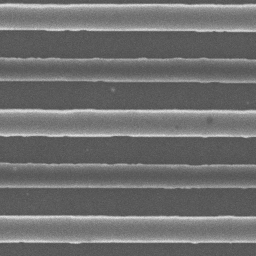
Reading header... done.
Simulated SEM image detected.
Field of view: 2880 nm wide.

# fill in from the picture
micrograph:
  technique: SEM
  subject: lines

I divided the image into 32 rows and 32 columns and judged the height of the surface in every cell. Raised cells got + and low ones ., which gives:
................................
++++++++++++++++++++++++++++++++
++++++++++++++++++++++++++++++++
++++++++++++++++++++++++++++++++
................................
................................
................................
+++++++++++++++++++++++++++++++.
++++++++++++++++++++++++++++++++
++++++++++++++++++++++++++++++++
................................
................................
................................
................................
++++++++++++++++++++++++++++++++
++++++++++++++++++++++++++++++++
++++++++++++++++++++++++++++++++
................................
................................
................................
+...............................
++++++++++++++++++++++++++++++++
++++++++++++++++++++++++++++++++
................................
................................
................................
................................
++++++++++++++++++++++++++++++++
++++++++++++++++++++++++++++++++
++++++++++++++++++++++++++++++++
................................
................................